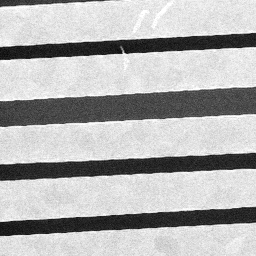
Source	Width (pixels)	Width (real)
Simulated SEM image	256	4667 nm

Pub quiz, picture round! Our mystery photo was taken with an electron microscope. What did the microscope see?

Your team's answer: lines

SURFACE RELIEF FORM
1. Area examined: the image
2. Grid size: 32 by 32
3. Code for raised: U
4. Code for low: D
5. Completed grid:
DDDDDDDDUUUUUUUUUUUUUUUUUUUUUUUU
UUUUUUUUUUUUUUUUUUUUUUUUUUUUUUUU
UUUUUUUUUUUUUUUUUUUUUUUUUUUUUUUU
UUUUUUUUUUUUUUUUUUUUUUUUUUUUUUUU
UUUUUUUUUUUUUUUUUUUUUUUUDDDDDDDD
UUUUUDDDDDDDDDDDDDDDDDDDDDDDDDDD
DDDDDDDDDDDDDDDDDDDDUUUUUUUUUUUU
DDUUUUUUUUUUUUUUUUUUUUUUUUUUUUUU
UUUUUUUUUUUUUUUUUUUUUUUUUUUUUUUU
UUUUUUUUUUUUUUUUUUUUUUUUUUUUUUUU
UUUUUUUUUUUUUUUUUUUUUUUUUUUUUUUU
UUUUUUUUUUUUUUUUUUUDDDDDDDDDDDDD
UUDDDDDDDDDDDDDDDDDDDDDDDDDDDDDD
DDDDDDDDDDDDDDDDDDDDDDDDDDDDDDDD
DDDDDDDDDDDDDDDDDDDDDDDDDDDDDDUU
DDDDDDDDUUUUUUUUUUUUUUUUUUUUUUUU
UUUUUUUUUUUUUUUUUUUUUUUUUUUUUUUU
UUUUUUUUUUUUUUUUUUUUUUUUUUUUUUUU
UUUUUUUUUUUUUUUUUUUUUUUUUUUUUUUU
UUUUUUUUUUUUUUUUUUUUUDDDDDDDDDDD
DDDDDDDDDDDDDDDDDDDDDDDDDDDDDDDD
DDDDDDDDDDDDDDDDDDDDDDDDUUUUUUUU
DDDDUUUUUUUUUUUUUUUUUUUUUUUUUUUU
UUUUUUUUUUUUUUUUUUUUUUUUUUUUUUUU
UUUUUUUUUUUUUUUUUUUUUUUUUUUUUUUU
UUUUUUUUUUUUUUUUUUUUUUUUUUUUUUUU
UUUUUUUUUUUUUUUUUUUUDDDDDDDDDDDD
UUUDDDDDDDDDDDDDDDDDDDDDDDDDDDDD
DDDDDDDDDDDDDDDDDDDUUUUUUUUUUUUU
DUUUUUUUUUUUUUUUUUUUUUUUUUUUUUUU
UUUUUUUUUUUUUUUUUUUUUUUUUUUUUUUU
UUUUUUUUUUUUUUUUUUUUUUUUUUUUUUUU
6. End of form